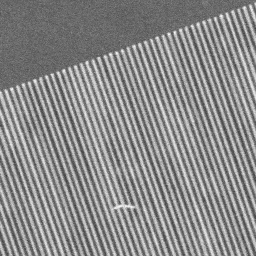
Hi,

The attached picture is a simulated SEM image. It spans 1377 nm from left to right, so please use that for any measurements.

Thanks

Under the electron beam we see parallel lines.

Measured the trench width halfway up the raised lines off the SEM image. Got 0.0203 microns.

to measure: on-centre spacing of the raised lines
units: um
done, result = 0.0331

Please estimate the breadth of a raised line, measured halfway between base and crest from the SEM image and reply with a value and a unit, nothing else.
10.8 nm